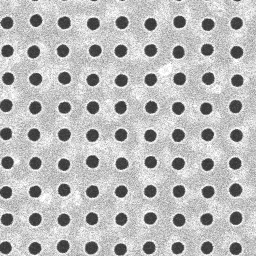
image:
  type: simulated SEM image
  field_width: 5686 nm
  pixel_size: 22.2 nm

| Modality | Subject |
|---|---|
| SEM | a regular array of holes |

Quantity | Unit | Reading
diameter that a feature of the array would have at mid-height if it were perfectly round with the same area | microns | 0.295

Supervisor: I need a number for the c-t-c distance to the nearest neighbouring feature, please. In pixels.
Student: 27.3